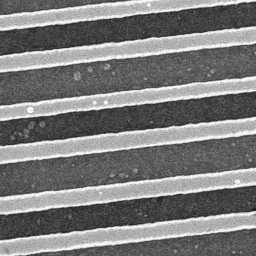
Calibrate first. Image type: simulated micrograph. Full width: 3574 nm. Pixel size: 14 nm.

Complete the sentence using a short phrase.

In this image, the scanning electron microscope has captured lines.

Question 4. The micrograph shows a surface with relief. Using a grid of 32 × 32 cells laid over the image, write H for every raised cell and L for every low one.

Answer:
LLLLLLLLLLLLLHHHHHHHHHHHHHHHHLLL
LLLLHHHHHHHHHHHHHHHHLLLLLLLLLLLL
HHHHHHHHHHHHLLLLLLLLLLLLLLLLLLLL
HHHLLLLLLLLLLLLLLLLLLLLLLLLLLLHH
LLLLLLLLLLLLLLLLLLLLLLHHHHHHHHHH
LLLLLLLLLLLLLHHHHHHHHHHHHHHHHHHH
LLLLHHHHHHHHHHHHHHHHHHLLLLLLLLLL
HHHHHHHHHHHHHLLLLLLLLLLLLLLLLLLL
HHHHLLLLLLLLLLLLLLLLLLLLLLLLLLLL
LLLLLLLLLLLLLLLLLLLLLLLLLLLLLLLL
LLLLLLLLLLLLLLLLLLLLLLLLHHHHHHHH
LLLLLLLLLLLLLLLHHHHHHHHHHHHHHHHL
LLLLLLLHHHHHHHHHHHHHHHHLLLLLLLLL
HHHHHHHHHHHHHLLLLLLLLLLLLLLLLLLL
HHHHHLLLLLLLLLLLLLLLLLLLLLLLLLLL
LLLLLLLLLLLLLLLLLLLLLLLLLHHHHHHH
LLLLLLLLLLLLLLLHHHHHHHHHHHHHHHHH
LLLLLLLLHHHHHHHHHHHHHHHHHLLLLLLL
HHHHHHHHHHHHHHHHHLLLLLLLLLLLLLLL
HHHHHHHHHLLLLLLLLLLLLLLLLLLLLLLL
LLLLLLLLLLLLLLLLLLLLLLLLLLLLLLLL
LLLLLLLLLLLLLLLLLLLLLLLLLLLLHHHH
LLLLLLLLLLLLLLLLLLLHHHHHHHHHHHHH
LLLLLLLLLLHHHHHHHHHHHHHHHHHHLLLL
LLHHHHHHHHHHHHHHHHHHLLLLLLLLLLLL
HHHHHHHHHHHLLLLLLLLLLLLLLLLLLLLL
HHHLLLLLLLLLLLLLLLLLLLLLLLLLLLLH
LLLLLLLLLLLLLLLLLLLLLLLHHHHHHHHH
LLLLLLLLLLLLLHHHHHHHHHHHHHHHHHHH
LLLLLHHHHHHHHHHHHHHHHHHLLLLLLLLL
HHHHHHHHHHHHHHHLLLLLLLLLLLLLLLLL
HHHHHLLLLLLLLLLLLLLLLLLLLLLLLLLL